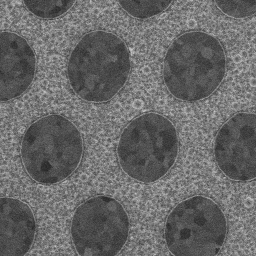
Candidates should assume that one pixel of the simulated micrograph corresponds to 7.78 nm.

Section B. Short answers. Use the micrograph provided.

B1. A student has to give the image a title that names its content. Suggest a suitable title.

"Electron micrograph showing raised bodies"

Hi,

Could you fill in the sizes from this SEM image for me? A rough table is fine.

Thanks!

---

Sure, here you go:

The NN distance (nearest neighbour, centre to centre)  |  734 nm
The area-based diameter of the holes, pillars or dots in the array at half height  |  66.4 pixels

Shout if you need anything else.